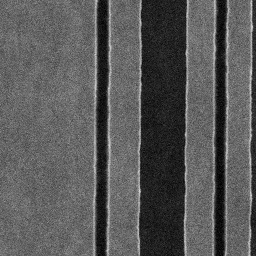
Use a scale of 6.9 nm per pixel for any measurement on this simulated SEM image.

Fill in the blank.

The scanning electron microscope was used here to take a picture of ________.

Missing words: lines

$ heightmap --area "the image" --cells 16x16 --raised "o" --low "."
ooooooooo...oooo
ooooooooo...oooo
ooooooooo...oooo
ooooooooo...oooo
ooooooooo...oooo
ooooooooo...oooo
ooooooooo...oooo
ooooooooo...oooo
ooooooooo...oooo
ooooooooo...oooo
ooooooooo...oooo
ooooooooo...oooo
ooooooooo...oooo
ooooooooo...oooo
ooooooooo...oooo
ooooooooo...oooo